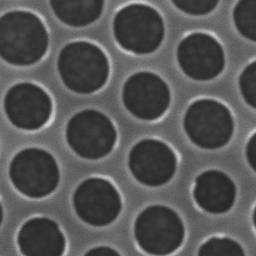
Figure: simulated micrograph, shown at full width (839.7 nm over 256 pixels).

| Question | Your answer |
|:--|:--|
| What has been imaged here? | a regular array of holes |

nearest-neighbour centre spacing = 221 nm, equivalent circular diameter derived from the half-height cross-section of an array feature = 158 nm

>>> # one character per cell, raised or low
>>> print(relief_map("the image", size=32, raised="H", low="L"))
HHHHHHLLLLLLLHHHHLHHHHLLLLLHHHLL
HLLLHHHLLLLLLHHLLLLLHHHLLLHHHLLL
LLLLLHHHLLLLHHLLLLLLHHHHHHHHHLLL
LLLLLLHHHHHHHHLLLLLLLHHHHHHHHHLL
LLLLLLHHHHHHHHLLLLLLHHHHLLHHHHLL
LLLLLLHHHLLHHHHLLLLLHHLLLLLHHHHH
LLLLLLHHLLLLLHHHHLLHHHLLLLLLHHHH
HLLLLHHLLLLLLHHHHHHHHHLLLLLLHHHH
HHHHHHHLLLLLLLHHHHHHHHHLLLLLHHHL
HHHHHHHHLLLLLLHHLLLLHHHHLLLHHHLL
HHLLHHHHLLLLLHHHLLLLLHHHHHHHHHLL
HLLLLLHHHLLLHHHLLLLLLHHHHHHHHHLL
HLLLLLHHHHHHHHHLLLLLLHHHHLLHHHHL
HLLLLLHHHHHHHHHHLLLLLHHHLLLLHHHH
HLLLLLHHHLLLLHHHHLLLHHHLLLLLLHHH
HHLLLHHHLLLLLLHHHHHHHHHLLLLLLHHH
HHHHHHHHLLLLLLHHHHHHHHHLLLLLLHHH
HHHHHHHHLLLLLLHHHHLLHHHHLLLLLHHL
HHHHLHHHHLLLLLHHHLLLLHHHHLLHHHHL
HHLLLLLHHHLLLHHHLLLLLLHHHHHHHHHL
HLLLLLLHHHHHHHHHLLLLLLHHHHHHHHHL
HLLLLLLHHHHHHHHHLLLLLLHHHHLLHHHH
HLLLLLLHHHHLLHHHHLLLLHHHHLLLLHHH
HHLLLLLHHHLLLLHHHHHHHHHHLLLLLHHH
HHHLLLHHHLLLLLLHHHHHHHHHLLLLLHHH
HHHHHHHHHLLLLLLHHHHHHHHHHLLLLHHH
HHHHHHHHHLLLLLLHHHLLLLHHHHLLHHHH
HHHHLLHHHHLLLLHHHLLLLLLHHHHHHHHH
HHHLLLLHHHHHHHHHHLLLLLLHHHHHHHHH
HHLLLLLLHHHHHHHHHLLLLLLHHHHHHHHH
HHLLLLLLHHHHHHHHHLLLLLLHHLLLLLHH
HHHLLLLLHHHLLLLHHHLLLLHHHLLLLLHH